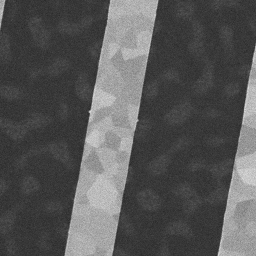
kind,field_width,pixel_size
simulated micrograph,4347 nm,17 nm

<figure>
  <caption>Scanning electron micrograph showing one or a few lines or trenches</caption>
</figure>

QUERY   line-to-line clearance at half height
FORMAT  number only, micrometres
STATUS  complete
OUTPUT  1.77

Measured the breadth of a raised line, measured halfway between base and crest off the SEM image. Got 46.9 pixels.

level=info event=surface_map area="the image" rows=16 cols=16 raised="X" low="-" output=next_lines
-------XXX------
-------XXX------
------XXX-------
------XXX-------
------XXX-------
------XXX------X
------XXX------X
------XXX------X
-----XXX-------X
-----XXX-------X
-----XXX-------X
-----XXX------XX
-----XXX------XX
----XXX-------XX
----XXX-------XX
----XXX-------XX